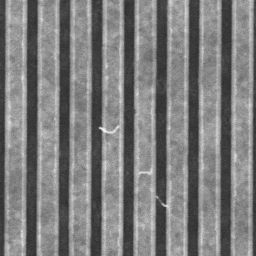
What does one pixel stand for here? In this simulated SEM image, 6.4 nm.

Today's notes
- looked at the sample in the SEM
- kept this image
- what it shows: parallel lines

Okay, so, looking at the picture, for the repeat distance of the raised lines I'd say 0.207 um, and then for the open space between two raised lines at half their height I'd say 0.0936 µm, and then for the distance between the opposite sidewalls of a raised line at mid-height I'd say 18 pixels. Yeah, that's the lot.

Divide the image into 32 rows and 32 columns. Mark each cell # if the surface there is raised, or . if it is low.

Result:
.##..##..##..##..##..##..##..##.
.##..##..##..##..##..##..##..##.
.##..##..##..##..##..##..##..##.
.##..##..##..##..##..##..##..##.
.##..##..##..##..##..##..##..##.
.##..##..##..##..##..##..##..##.
.##..##..##..##..##..##..##..##.
.##..##..##..##..##..##..##..##.
.##..##..##..##..##..##..##..##.
.##..##..##..##..##..##..##..##.
.##..##..##..##..##..##..##..##.
.##..##..##..##..##..##..##..##.
.##..##..##..##..##..##..##..##.
.##..##..##..##..##..##..##..##.
.##..##..##..##..##..##..##..##.
.##..##..##..##..##..##..##..##.
.##..##..##..##..##..##..##..##.
.##..##..##..##..##..##..##..##.
.##..##..##..##..##..##..##..##.
.##..##..##..##..##..##..##..##.
.##..##..##..##..##..##..##..##.
.##..##..##..##..##..##..##..##.
.##..##..##..##..##..##..##..##.
.##..##..##..##..##..##..##..##.
.##..##..##..##..##..##..##..##.
.##..##..##..##..##..##..##..##.
.##..##..##..##..##..##..##..##.
.##..##..##..##..##..##..##..##.
.##..##..##..##..##..##..##..##.
.##..##..##..##..##..##..##..##.
.##..##..##..##..##..##..##..##.
.##..##..##..##..##..##..##..##.